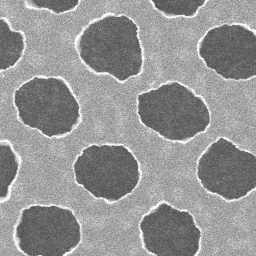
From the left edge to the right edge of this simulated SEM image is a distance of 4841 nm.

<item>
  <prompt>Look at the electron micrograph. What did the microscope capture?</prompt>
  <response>holes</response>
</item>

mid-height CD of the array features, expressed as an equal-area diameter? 1160 nanometers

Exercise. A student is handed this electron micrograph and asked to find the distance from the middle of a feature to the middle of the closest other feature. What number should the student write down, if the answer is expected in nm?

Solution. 1670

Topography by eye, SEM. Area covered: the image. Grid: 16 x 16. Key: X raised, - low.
XXX--XXXXX--XXXX
XXXXXX--XXXXXXXX
-XXXX----XXXX---
-XXXX----XXXX---
XXXXXX---XXXX---
X---XXXXXX--XXXX
X----XXXX----XXX
X----XXXX----XXX
XXXXXXXXXX--XXXX
-XXXX---XXXXX--X
-XXXX----XXX----
-XXXX----XXXX---
XXXXXXXXXXXXXXXX
X----XXXX---XXXX
X----XXXX---XXXX
X----XXXX---XXXX